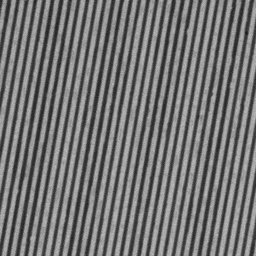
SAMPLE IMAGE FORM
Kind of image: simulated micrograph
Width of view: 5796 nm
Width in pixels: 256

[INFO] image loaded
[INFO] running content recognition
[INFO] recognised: parallel lines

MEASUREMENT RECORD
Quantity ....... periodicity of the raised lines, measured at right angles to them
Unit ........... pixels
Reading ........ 8.54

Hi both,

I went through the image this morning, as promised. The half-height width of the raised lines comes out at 78.1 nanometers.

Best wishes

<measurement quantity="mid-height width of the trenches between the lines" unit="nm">114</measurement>